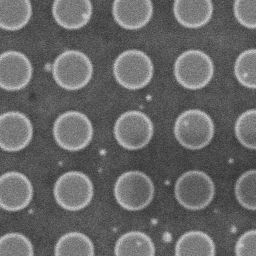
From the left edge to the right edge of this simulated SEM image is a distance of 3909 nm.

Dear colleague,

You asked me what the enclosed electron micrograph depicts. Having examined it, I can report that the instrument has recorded an array of small figures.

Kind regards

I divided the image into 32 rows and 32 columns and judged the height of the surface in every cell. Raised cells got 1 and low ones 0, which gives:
11110001111000111110001111000111
11110001111000111110001111000111
11100001111000011100001111000011
01000000000000000000000000000000
00000000000000000000000000000000
00000000000000000000000000000000
00000000010000001000000010000001
11100001111000011110001111000011
11110001111000111110001111000111
11110001111000111110001111000011
11100001111000011100000111000011
00000000000000000000000000000000
00000000000000000000000000000000
00000000000000000000000000000000
11100000110000011100000111000011
11110001111000011110001111000011
11110001111000111110001111100011
11110001111000011110001111000011
11100000110000001000000010000000
00000000000000000000000000000000
00000000000000000000000000000000
00000000000000000000000010000001
11100001111000011110001111000011
11110001111000111110001111100011
11110001111000111110001111100011
11100000111000011100000111000011
00000000000000000000000000000000
00000000000000000000000000000000
00000000000000000000000000000000
01100000110000001100000111000011
11110001111000011110001111100011
11110001111100111110001111100011